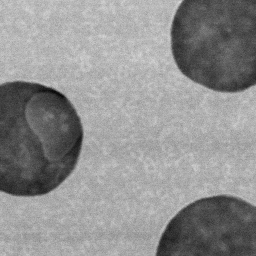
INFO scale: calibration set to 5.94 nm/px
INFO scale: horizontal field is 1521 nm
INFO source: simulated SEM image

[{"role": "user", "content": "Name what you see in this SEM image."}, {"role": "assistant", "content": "holes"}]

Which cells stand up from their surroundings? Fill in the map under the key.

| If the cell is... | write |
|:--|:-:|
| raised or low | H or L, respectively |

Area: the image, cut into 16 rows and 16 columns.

HHHHHHHHHHHLLLLL
HHHHHHHHHHHLLLLL
HHHHHHHHHHHLLLLL
HHHHHHHHHHHLLLLL
HHHHHHHHHHHLLLLL
LLLHHHHHHHHHHLLL
LLLLHHHHHHHHHHHH
LLLLLHHHHHHHHHHH
LLLLLHHHHHHHHHHH
LLLLLHHHHHHHHHHH
LLLLLHHHHHHHHHHH
LLLLHHHHHHHHHHHH
HHHHHHHHHHHHLLLH
HHHHHHHHHHHLLLLL
HHHHHHHHHHLLLLLL
HHHHHHHHHHLLLLLL